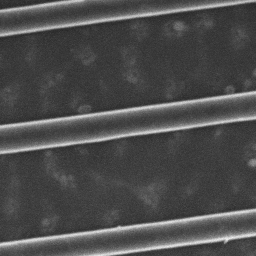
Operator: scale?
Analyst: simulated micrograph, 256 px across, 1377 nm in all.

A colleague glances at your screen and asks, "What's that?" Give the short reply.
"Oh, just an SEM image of one or a few lines or trenches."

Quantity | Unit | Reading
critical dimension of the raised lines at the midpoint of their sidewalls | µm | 0.136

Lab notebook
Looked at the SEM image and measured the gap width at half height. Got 489 nm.